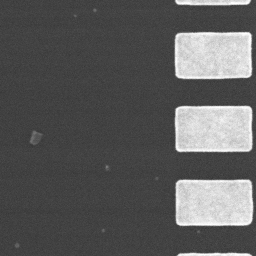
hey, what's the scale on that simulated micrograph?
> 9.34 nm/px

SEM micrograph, wiring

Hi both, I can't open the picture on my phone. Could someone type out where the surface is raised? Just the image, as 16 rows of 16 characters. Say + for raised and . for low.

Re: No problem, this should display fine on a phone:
................
................
...........+++++
...........+++++
...........+++++
................
................
...........+++++
...........+++++
................
................
...........+++++
...........+++++
...........+++++
................
................